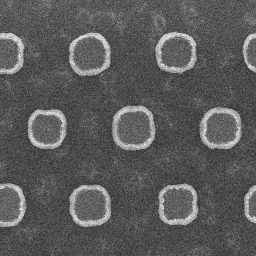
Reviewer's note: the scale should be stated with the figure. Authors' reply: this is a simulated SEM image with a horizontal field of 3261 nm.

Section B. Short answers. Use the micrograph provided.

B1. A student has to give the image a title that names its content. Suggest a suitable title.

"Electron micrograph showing raised bodies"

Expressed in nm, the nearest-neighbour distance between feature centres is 1090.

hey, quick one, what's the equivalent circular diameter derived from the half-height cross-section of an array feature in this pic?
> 498 nanometers